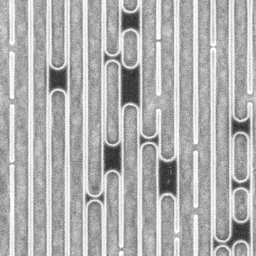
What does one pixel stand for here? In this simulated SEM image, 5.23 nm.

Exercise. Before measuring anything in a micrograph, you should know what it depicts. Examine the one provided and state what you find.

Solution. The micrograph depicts parallel lines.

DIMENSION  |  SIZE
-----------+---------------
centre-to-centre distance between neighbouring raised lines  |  95.7 nanometres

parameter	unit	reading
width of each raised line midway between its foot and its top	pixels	3.88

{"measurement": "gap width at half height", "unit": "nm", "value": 75.8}